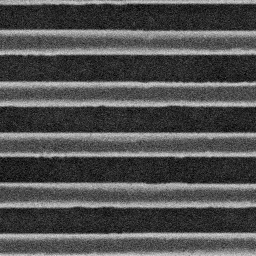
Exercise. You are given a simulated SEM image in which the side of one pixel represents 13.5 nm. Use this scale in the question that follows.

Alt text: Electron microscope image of lines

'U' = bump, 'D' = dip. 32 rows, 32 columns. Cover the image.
DDDDDDDDDDDDDDDDDDDDDDDDDDDDDDDD
DDDDDDDDDDDDDDDDDDDDDDDDDDDDDDDD
DDDDDDDDDDDDDDDDDDDDDDDDDDDDDDDD
DDDDDDDDDDDDDDDDDDDDDDDDDDDDDDDD
UUUUUUUUUUUUUUUUUUUUUUUUUUUUUUUU
UUUUUUUUUUUUUUUUUUUUUUUUUUUUUUUU
UUUUUUUUUUUUUUUUUUUUUUUUUUUUUUUU
DDDDDDDDDDDDDDDDDDDDDDDDDDDDDDDD
DDDDDDDDDDDDDDDDDDDDDDDDDDDDDDDD
DDDDDDDDDDDDDDDDDDDDDDDDDDDDDDDD
DDDDUUUUUUUUUUUUUUUUUUUUUUUUUUUU
UUUUUUUUUUUUUUUUUUUUUUUUUUUUUUUU
UUUUUUUUUUUUUUUUUUUUUUUUUUUUUUUU
DDDDDDDDDDDDDDDDDDDDDDDDDDDDDDDD
DDDDDDDDDDDDDDDDDDDDDDDDDDDDDDDD
DDDDDDDDDDDDDDDDDDDDDDDDDDDDDDDD
DDDDDDDDDDDDDDDDDDDDDDDDDDDDDDDD
UUUUUUUUUUUUUUUUUUUUUUUUUUUUUUUU
UUUUUUUUUUUUUUUUUUUUUUUUUUUUUUUU
UUUUUUUUUDDUDDUDDDDDDUUDDDUDDDDD
DDDDDDDDDDDDDDDDDDDDDDDDDDDDDDDD
DDDDDDDDDDDDDDDDDDDDDDDDDDDDDDDD
DDDDDDDDDDDDDDDDDDDDDDDDDDDDDDDD
UUUUUUUUUUUUUUUUUUUUUUUUUUUUUUUU
UUUUUUUUUUUUUUUUUUUUUUUUUUUUUUUU
UUUUUUUUUUUUUUUUUUUUUUUUUUUUUUUU
DDDDDDDDDDDDDDDDDDDDDDDDDDDDDDDD
DDDDDDDDDDDDDDDDDDDDDDDDDDDDDDDD
DDDDDDDDDDDDDDDDDDDDDDDDDDDDDDDD
UUUUUUUUUUUUUUUUUUUUUUUUUUUUUUUU
UUUUUUUUUUUUUUUUUUUUUUUUUUUUUUUU
UUUUUUUUUUUUUUUUUUUUUUUUUUUUUUUU